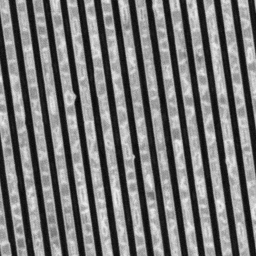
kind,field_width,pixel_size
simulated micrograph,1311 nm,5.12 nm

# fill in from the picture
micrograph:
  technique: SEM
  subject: parallel lines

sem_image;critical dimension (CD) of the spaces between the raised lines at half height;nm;38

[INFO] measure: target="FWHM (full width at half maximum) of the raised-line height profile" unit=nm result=47.5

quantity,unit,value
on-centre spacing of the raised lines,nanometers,86.6